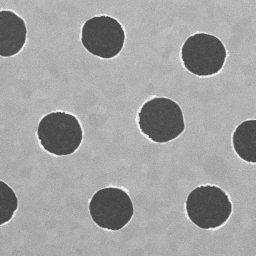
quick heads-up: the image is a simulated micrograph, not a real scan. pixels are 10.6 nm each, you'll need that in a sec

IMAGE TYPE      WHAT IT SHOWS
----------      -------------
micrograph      holes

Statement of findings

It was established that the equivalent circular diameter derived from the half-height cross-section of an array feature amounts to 43.8 pixels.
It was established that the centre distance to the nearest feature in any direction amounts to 968 nm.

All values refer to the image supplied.